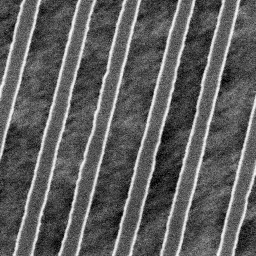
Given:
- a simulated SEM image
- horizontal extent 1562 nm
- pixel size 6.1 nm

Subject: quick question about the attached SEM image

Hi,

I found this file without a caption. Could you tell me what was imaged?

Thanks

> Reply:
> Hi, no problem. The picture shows lines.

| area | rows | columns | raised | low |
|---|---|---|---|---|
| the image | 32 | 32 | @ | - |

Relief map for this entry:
---@@-----@@---@@-----@@----@@--
--@@@----@@@---@@-----@@----@@--
--@@-----@@----@@-----@@---@@---
--@@-----@@----@@----@@----@@---
--@@-----@@---@@-----@@----@@---
--@@----@@----@@-----@@---@@@---
-@@-----@@----@@-----@@---@@----
-@@-----@@----@@----@@----@@----
-@@-----@@---@@-----@@----@@----
-@@----@@----@@-----@@---@@@----
@@-----@@----@@-----@@---@@-----
@@-----@@----@@----@@@---@@-----
@@-----@@---@@@----@@----@@-----
@@----@@@---@@-----@@----@@-----
@-----@@----@@-----@@---@@-----@
@-----@@----@@----@@----@@-----@
@-----@@----@-----@@----@@-----@
@----@@@---@@-----@@----@@-----@
-----@@----@@-----@@---@@@----@@
-----@@----@@----@@----@@-----@@
-----@@---@@@----@@----@@-----@@
----@@@---@@-----@@----@@-----@@
----@@----@@-----@@---@@@----@@@
----@@---@@@----@@----@@-----@@-
----@@---@@@----@@----@@-----@@-
---@@@---@@-----@@----@@-----@@-
---@@----@@----@@@---@@-----@@@-
---@@----@@----@@@---@@-----@@--
---@@---@@-----@@----@@-----@@--
--@@@---@@-----@@----@@-----@@--
--@@----@@-----@@---@@@-----@@--
--@@---@@@----@@----@@-----@@---